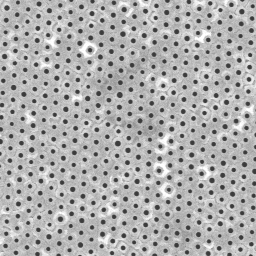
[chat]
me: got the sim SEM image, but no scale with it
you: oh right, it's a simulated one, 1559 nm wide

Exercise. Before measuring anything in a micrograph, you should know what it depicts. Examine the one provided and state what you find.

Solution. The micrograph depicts a regular array of holes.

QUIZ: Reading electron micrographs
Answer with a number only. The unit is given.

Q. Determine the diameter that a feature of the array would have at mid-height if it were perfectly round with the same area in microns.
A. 0.0257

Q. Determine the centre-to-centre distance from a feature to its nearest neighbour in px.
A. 12